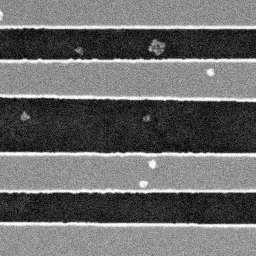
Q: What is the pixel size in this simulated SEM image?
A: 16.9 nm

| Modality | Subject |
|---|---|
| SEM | lines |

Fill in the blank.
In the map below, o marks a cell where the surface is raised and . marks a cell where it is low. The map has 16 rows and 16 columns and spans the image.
oooooooooooooooo
oooooooooooooooo
................
................
oooooooooooooooo
oooooooooooooooo
................
................
................
................
oooooooooooooooo
oooooooooooooooo
................
................
oooooooooooooooo
oooooooooooooooo